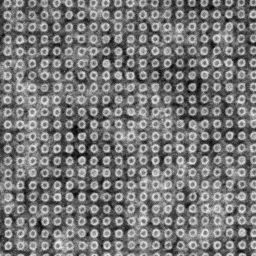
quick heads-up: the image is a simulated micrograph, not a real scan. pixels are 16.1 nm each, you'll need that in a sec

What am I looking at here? a regular array of raised bodies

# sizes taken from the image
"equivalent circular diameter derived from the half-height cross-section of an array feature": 106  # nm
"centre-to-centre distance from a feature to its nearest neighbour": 191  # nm